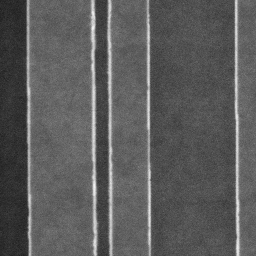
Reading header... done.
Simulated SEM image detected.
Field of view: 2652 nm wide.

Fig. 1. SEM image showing lines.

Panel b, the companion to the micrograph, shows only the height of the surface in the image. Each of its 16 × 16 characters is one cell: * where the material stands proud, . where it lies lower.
..*******......*
..*******......*
..*******......*
..*******......*
..*******......*
..*******......*
..*******......*
..*******......*
..*******......*
..*******......*
..*******......*
..*******......*
..*******......*
..*******......*
..*******......*
..*******......*